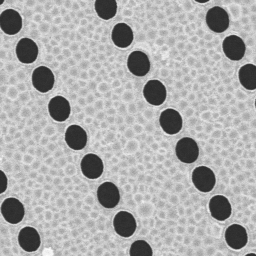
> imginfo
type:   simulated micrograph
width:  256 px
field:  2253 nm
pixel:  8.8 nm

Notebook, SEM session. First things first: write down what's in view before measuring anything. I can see a regular array of holes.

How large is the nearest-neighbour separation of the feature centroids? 0.289 microns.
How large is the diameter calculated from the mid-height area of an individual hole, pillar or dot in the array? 214 nm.